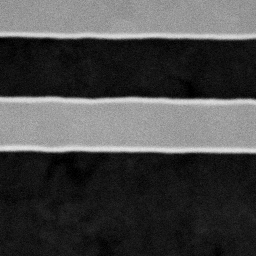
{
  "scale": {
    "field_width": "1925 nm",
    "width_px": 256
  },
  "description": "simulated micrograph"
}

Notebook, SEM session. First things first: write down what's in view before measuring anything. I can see wiring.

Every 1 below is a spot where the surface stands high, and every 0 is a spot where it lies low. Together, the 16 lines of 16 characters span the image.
1111111111111111
1111111111111111
0000000000000000
0000000000000000
0000000000000000
0000000000000000
1111111111111111
1111111111111111
1111111111111111
0000000000000000
0000000000000000
0000000000000000
0000000000000000
0000000000000000
0000000000000000
0000000000000000